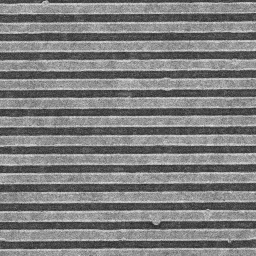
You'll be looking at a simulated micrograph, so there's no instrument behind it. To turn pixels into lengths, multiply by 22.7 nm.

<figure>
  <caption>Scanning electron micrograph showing parallel lines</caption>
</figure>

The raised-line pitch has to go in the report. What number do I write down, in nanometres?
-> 429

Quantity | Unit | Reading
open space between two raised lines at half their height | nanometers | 210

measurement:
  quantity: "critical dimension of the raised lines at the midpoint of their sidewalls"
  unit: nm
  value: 210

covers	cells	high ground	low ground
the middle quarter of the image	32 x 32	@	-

@@@@@@@@@@@@@@@@@@@@@@@@@@@@@@@@
@@@@@@--------------------------
--------------------------------
--------------------------------
@@@@@@@@@@@@@@@@@@@@@@@@@@@@@@@@
@@@@@@@@@@@@@@@@@@@@@@@@@@@@@@@@
--------------------------------
--------------------------------
--------------------------------
@@@@@@@@@@@@@@@@@@@@@@@@@@@@@@@@
@@@@@@@@@@@@@@@@@@@@@@@@@@@@@@@@
--------------------------------
--------------------------------
@@@@@@@@@@@@@@@@@@@@@@@@@@@@@@@@
@@@@@@@@@@@@@@@@@@@@@@@@@@@@@@@@
--------@-----------------------
--------------------------------
--------------------------------
@@@@@@@@@@@@@@@@@@@@@@@@@@@@@@@@
@@@@@@@@@@@@@@@@@@@@@@@@@@@@@@@@
--------------------------------
--------------------------------
--------------------------------
@@@@@@@@@@@@@@@@@@@@@@@@@@@@@@@@
@@@@@@@@@@@@@@@@@@@@@@@@@@@@@@@@
--------------------------------
--------------------------------
------@@@@@@@@@@--@@@@@@@@@@@@@@
@@@@@@@@@@@@@@@@@@@@@@@@@@@@@@@@
@@@@@@@@@@@@@@@@@@@@@@-@@@@@--@-
--------------------------------
--------------------------------